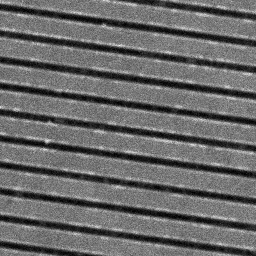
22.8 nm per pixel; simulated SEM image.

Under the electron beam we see parallel lines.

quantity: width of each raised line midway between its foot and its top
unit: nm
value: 412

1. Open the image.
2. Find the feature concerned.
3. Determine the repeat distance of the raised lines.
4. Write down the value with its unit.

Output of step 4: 594 nm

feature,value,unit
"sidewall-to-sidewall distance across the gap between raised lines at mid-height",175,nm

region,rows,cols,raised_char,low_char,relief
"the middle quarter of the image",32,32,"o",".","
..oooooooooooooooooooooooooooooo
.........ooooooooooooooooooooooo
o...............oooooooooooooooo
oooooooo...............ooooooooo
ooooooooooooooo...............oo
oooooooooooooooooooooo..........
ooooooooooooooooooooooooooooo...
.....ooooooooooooooooooooooooooo
............oooooooooooooooooooo
ooooo..............ooooooooooooo
oooooooooooo..............oooooo
ooooooooooooooooooo.............
oooooooooooooooooooooooooo......
..oooooooooooooooooooooooooooooo
.........ooooooooooooooooooooooo
................oooooooooooooooo
ooooooo................ooooooooo
ooooooooooooooo...............oo
oooooooooooooooooooooo..........
ooooooooooooooooooooooooooooo...
....oooooooooooooooooooooooooooo
...........ooooooooooooooooooooo
ooo...............oooooooooooooo
oooooooooo...............ooooooo
ooooooooooooooooo...............
oooooooooooooooooooooooo........
ooooooooooooooooooooooooooooooo.
.......ooooooooooooooooooooooooo
..............oooooooooooooooooo
ooooo................ooooooooooo
oooooooooooooo..............oooo
ooooooooooooooooooooo...........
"